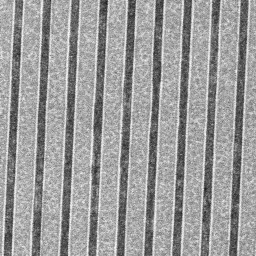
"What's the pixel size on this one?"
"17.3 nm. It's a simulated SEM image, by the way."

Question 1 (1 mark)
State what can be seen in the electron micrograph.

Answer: parallel lines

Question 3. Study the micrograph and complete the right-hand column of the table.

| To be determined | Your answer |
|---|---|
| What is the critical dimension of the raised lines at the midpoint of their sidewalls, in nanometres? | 322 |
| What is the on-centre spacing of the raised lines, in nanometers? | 488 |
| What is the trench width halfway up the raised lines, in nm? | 169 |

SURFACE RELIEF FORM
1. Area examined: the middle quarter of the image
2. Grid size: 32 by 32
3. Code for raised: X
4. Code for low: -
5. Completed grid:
X--XXXXX---XXXX---XXXX---XXXX---
X--XXXXX---XXXX---XXXX---XXXX---
X--XXXXX--XXXXX--XXXXX---XXXX---
---XXXXX--XXXXX--XXXXX---XXXX---
---XXXXX--XXXXX--XXXXX---XXXX--X
---XXXXX--XXXXX--XXXXX--XXXXX--X
---XXXXX--XXXX---XXXXX--XXXXX--X
---XXXX---XXXX---XXXXX--XXXXX--X
---XXXX---XXXX---XXXXX--XXXXX--X
---XXXX---XXXX---XXXXX--XXXX---X
---XXXX---XXXX---XXXXX--XXXX---X
---XXXX---XXXX---XXXXX--XXXX---X
---XXXX---XXXX---XXXXX--XXXXX--X
---XXXX---XXXX---XXXX---XXXX---X
---XXXX---XXXX---XXXX---XXXX---X
---XXXX---XXXX---XXXX---XXXX---X
---XXXX---XXXX---XXXX---XXXX---X
---XXXX---XXXX---XXXX---XXXX---X
---XXXX---XXXX---XXXX---XXXX---X
---XXXX---XXXX---XXXX---XXXX---X
---XXXX---XXXX---XXXX---XXXX---X
---XXXX---XXXX---XXXX---XXXX---X
--XXXXX---XXXX---XXXX---XXXX---X
--XXXXX---XXXX---XXXX---XXXX--XX
--XXXXX--XXXXX---XXXX---XXXX--XX
--XXXXX--XXXXX--XXXXX---XXXX--XX
--XXXXX--XXXXX--XXXXX---XXXX---X
--XXXX---XXXXX--XXXXX--XXXXX---X
--XXXX---XXXX---XXXXX--XXXXX--XX
--XXXXX--XXXX---XXXXX--XXXXX--XX
--XXXXX--XXXX---XXXX---XXXXX--XX
--XXXX---XXXX---XXXX---XXXX---XX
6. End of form